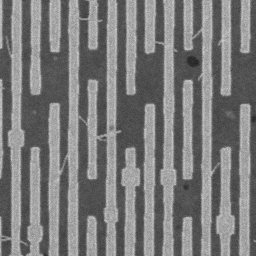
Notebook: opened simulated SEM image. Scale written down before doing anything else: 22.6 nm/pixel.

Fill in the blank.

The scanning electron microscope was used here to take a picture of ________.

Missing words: wiring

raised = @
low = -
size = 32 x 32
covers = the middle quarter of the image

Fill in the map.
-@@--------@@---@@-------@@-----
-@@--------@@---@@-------@@-----
-@@--------@@---@--------@@-----
-@@--------@@---@--------@@-----
-@@---@@---@@---@--------@@---@@
-@@---@@---@@---@--------@@---@@
-@@---@@---@@---@--------@@---@@
-@@---@@---@@------------@@---@@
-@@---@@---@@------------@@---@@
-@@---@@---@@------------@@---@@
-@@---@@---@@--------@---@@---@@
-@@---@@---@@-------@@---@@---@@
-@@---@@---@@-------@@---@@---@@
-@@---@@---@@-------@@---@@---@@
-@@---@@---@@-------@@---@@---@@
-@@---@@---@@-------@@---@@---@@
-@@---@@---@@-------@@---@@---@@
-@@---@@--@@@-------@@---@@---@@
-@@---@@@--@@-------@@---@@---@@
-@@---@@---@@-------@@---@@---@@
-@@---@@---@@-------@@---@@---@@
-@@---@@---@@---@@--@@---@@---@@
-@@---@@---@@---@@--@@---@@---@@
-@@---@@---@@---@---@@---@@---@@
-@@---@@---@@---@---@@@--@@---@@
-@@---@@---@@---@---@@@--@@---@@
-@@---@@---@@--@@@@-@@@--@@---@@
-@@---@@---@@--@@@@-@@@-@@@@--@@
-@@----@---@@--@@@@-@@@-@@@@--@@
-@@--------@@--@@@@-@@@-@@@@----
-@@--------@@--@@@--@@---@@-----
-@@--------@@---@@--@@---@@-----